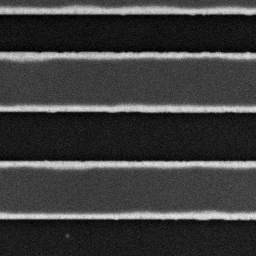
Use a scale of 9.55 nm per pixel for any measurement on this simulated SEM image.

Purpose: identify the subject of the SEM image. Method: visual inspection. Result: lines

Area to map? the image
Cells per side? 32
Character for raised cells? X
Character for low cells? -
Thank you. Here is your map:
XXXXXXXXXXXXXXXXXXXXXXXXXXXXXXXX
XXXXXXXXXXXXXXXXXXXXXXXXXXXXXXXX
--------------------------------
--------------------------------
--------------------------------
--------------------------------
--------------------------------
XXXXXXXXXXXXXXXXXXXXXXXXXXXXXXXX
XXXXXXXXXXXXXXXXXXXXXXXXXXXXXXXX
XXXXXXXXXXXXXXXXXXXXXXXXXXXXXXXX
XXXXXXXXXXXXXXXXXXXXXXXXXXXXXXXX
XXXXXXXXXXXXXXXXXXXXXXXXXXXXXXXX
XXXXXXXXXXXXXXXXXXXXXXXXXXXXXXXX
XXXXXXXXXXXXXXXXXXXXXXXXXXXXXXXX
--------------------------------
--------------------------------
--------------------------------
--------------------------------
--------------------------------
--------------------------------
XXXXXXXXXXXXXXXXXXXXXXXXXXXXXXXX
XXXXXXXXXXXXXXXXXXXXXXXXXXXXXXXX
XXXXXXXXXXXXXXXXXXXXXXXXXXXXXXXX
XXXXXXXXXXXXXXXXXXXXXXXXXXXXXXXX
XXXXXXXXXXXXXXXXXXXXXXXXXXXXXXXX
XXXXXXXXXXXXXXXXXXXXXXXXXXXXXXXX
XXXXXXXXXXXXXXXXXXXXXXXXXXXXXXXX
--------------------------------
--------------------------------
--------------------------------
--------------------------------
--------------------------------